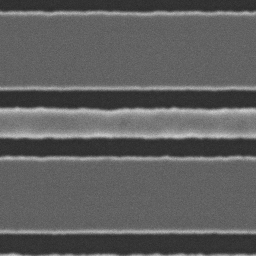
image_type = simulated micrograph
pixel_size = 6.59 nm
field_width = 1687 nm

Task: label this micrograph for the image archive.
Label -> lines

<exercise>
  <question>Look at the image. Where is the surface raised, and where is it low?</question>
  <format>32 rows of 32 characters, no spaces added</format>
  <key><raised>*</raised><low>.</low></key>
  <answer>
................................
******.********....**.***..**.**
********************************
********************************
********************************
********************************
********************************
********************************
********************************
********************************
********************************
................................
................................
..*..*..........................
********************************
********************************
********************************
................................
................................
................................
********************************
********************************
********************************
********************************
********************************
********************************
********************************
********************************
********************************
................................
................................
................................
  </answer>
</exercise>